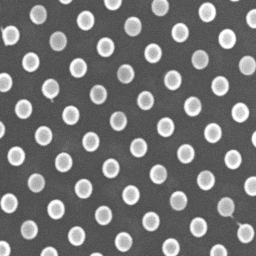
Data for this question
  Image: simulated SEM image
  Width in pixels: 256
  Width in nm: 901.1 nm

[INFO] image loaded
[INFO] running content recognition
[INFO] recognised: a regular array of raised bodies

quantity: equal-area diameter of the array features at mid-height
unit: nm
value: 60.2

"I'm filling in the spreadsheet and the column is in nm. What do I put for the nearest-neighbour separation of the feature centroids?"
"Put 116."